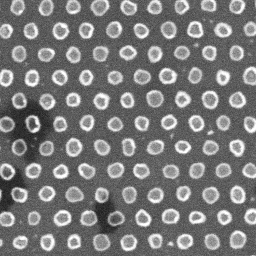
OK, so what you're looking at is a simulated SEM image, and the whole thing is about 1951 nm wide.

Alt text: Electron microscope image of a regular array of raised bodies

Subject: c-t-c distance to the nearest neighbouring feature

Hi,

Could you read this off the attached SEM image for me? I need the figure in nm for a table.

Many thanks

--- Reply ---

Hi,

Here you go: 199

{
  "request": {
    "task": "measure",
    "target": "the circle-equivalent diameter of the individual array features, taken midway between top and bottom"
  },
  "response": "113 nanometres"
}